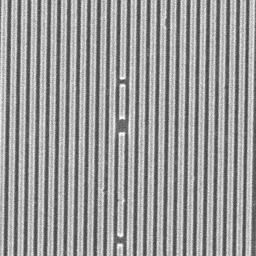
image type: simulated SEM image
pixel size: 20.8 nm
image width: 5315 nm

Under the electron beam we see parallel lines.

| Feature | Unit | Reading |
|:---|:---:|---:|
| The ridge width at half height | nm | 106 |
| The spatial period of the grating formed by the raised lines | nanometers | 206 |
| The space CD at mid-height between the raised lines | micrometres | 0.104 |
